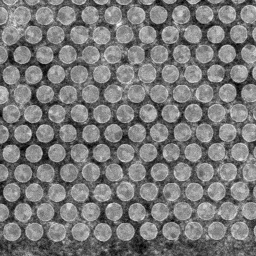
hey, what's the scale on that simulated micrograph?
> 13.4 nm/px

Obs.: a regular array of raised bodies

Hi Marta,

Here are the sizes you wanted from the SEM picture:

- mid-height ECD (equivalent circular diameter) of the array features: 0.23 micrometres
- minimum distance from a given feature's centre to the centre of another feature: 298 nm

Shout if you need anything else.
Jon